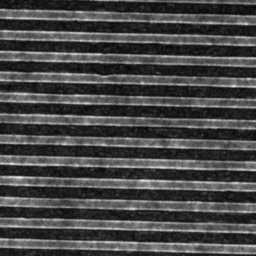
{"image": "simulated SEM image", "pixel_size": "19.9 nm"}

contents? parallel lines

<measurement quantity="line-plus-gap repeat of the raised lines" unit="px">20.9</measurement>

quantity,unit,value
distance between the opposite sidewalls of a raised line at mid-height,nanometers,164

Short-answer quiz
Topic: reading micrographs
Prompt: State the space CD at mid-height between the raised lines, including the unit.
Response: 256 nm